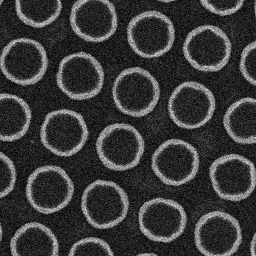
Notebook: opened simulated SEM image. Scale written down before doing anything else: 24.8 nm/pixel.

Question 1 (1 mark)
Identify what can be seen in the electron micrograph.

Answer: a regular array of raised bodies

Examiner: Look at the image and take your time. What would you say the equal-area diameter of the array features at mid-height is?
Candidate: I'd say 1070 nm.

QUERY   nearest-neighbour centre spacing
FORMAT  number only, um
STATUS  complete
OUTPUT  1.44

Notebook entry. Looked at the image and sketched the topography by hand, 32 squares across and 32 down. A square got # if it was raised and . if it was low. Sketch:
..#####...####............####..
..#####..#####.............##...
...###...#####...####...........
.........#####..#####....#......
..........###...#####...####....
.###.............####..######...
.####............###...######..#
######..####............####..##
#####...####.............##...##
.####..######..####............#
........#####.#####....#........
........####..######..####......
##.............####..#####.....#
###............####..#####...###
####..####............####..####
###...####............###...####
###..######..####............###
.....#####...#####............##
......####..######..####........
.............####..######.......
#.............###..######..####.
##...###............####...#####
##..#####............##....#####
#...#####..####............#####
....#####..####.............##..
....####..######..####..........
...........#####..#####.........
...........####...#####..####...
...###............#####..#####..
..####.............###...#####..
..#####...###............#####..
..#####..#####............###...